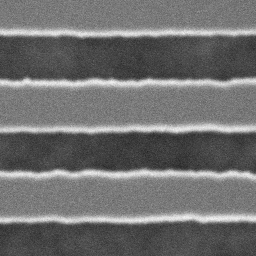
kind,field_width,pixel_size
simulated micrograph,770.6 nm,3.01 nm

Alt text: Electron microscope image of lines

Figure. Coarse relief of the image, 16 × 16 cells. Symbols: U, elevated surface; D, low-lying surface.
UUUUUUUUUUUUUUUU
UUUUUUUUUUUUUUUU
DDDDDDDDDDDDDDDD
DDDDDDDDDDDDDDDD
DDDDDDDDDDDDDDDD
UUUUUUUUUUUUUUUU
UUUUUUUUUUUUUUUU
UUUUUUUUUUUUUUUU
DDDDDDDDDDDDDDDD
DDDDDDDDDDDDDDDD
DDDDDDDDDDDDDDDD
UUUUUUUUUUUUUUUU
UUUUUUUUUUUUUUUU
UUUUUUUUUUUUUUUU
DDDDDDDDDDDDDDDD
DDDDDDDDDDDDDDDD